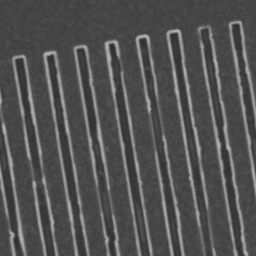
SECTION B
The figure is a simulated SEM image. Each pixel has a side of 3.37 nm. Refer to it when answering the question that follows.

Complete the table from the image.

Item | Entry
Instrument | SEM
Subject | parallel lines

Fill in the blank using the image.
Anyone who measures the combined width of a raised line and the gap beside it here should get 105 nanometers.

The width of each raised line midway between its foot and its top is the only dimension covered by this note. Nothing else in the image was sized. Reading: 23.3 pixels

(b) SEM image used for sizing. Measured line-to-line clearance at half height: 26.3 nm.